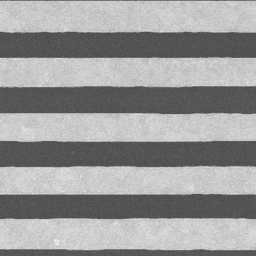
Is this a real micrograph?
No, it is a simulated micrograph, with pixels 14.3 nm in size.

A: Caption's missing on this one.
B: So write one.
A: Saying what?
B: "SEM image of lines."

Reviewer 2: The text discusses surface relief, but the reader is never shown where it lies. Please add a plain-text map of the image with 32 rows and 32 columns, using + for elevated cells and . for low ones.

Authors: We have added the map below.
++++++++++++++++++++++++++++++++
++++++++++++++++++++++++++++++++
++++++++++++++++++++++++++++++++
++++++++++++++++++++++++++++++++
................................
................................
................................
++++++++++++++++++++++++++++++++
++++++++++++++++++++++++++++++++
++++++++++++++++++++++++++++++++
++++++++++++++++++++++++++++++++
................................
................................
................................
++++++++++++++++++++++++++++++++
++++++++++++++++++++++++++++++++
++++++++++++++++++++++++++++++++
++++++++++++++++++++++++++++++++
................................
................................
................................
++++++++++++++++++++++++++++++++
++++++++++++++++++++++++++++++++
++++++++++++++++++++++++++++++++
................................
................................
................................
++++++++++++++++++++++++++++++++
++++++++++++++++++++++++++++++++
++++++++++++++++++++++++++++++++
++++++++++++++++++++++++++++++++
................................